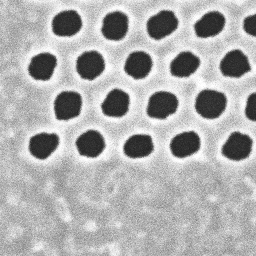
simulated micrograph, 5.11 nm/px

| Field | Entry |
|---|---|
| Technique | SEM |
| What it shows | a regular array of holes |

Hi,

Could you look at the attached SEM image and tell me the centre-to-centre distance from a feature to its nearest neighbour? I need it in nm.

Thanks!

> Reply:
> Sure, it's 235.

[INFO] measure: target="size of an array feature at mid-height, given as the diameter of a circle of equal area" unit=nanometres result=150